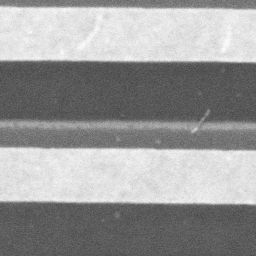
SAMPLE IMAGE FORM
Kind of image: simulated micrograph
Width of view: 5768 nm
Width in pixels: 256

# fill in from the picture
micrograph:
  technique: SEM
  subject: lines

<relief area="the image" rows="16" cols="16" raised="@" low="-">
@@@@@@@@@@@@@@@@
@@@@@@@@@@@@@@@@
@@@@@@@@@@@@@@@@
@@@@@@@@@@@@@@@@
----------------
----------------
----------------
----------------
@@@@@@@@@@@@@@@@
@@@@@@@@@@@@@@@@
@@@@@@@@@@@@@@@@
@@@@@@@@@@@@@@@@
@@@@@@@@@@@@@@@@
----------------
----------------
----------------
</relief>